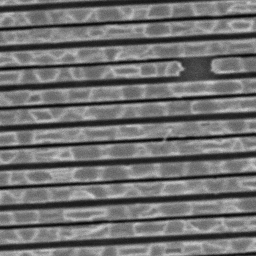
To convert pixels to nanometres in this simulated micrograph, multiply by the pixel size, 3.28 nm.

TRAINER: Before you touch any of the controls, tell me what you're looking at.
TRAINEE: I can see parallel lines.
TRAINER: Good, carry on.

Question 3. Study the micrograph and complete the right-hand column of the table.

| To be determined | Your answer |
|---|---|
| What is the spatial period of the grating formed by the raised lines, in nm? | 64.7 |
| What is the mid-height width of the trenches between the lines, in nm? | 20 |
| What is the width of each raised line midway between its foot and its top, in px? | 15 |